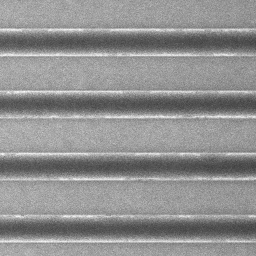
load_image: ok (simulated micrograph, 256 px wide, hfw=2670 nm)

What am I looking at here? lines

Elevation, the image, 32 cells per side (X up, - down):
--------------------------------
--------------------------------
--------------------------------
--------------------------------
XXXXXXXXXXXXXXXXXXXXXXXXXXXXXXXX
XXXXXXXXXXXXXXXXXXXXXXXXXXXXXXXX
XXXXXXXXXXXXXXXXXXXXXXXXXXXXXXXX
--------------------------------
--------------------------------
--------------------------------
--------------------------------
XXXXXXXXXXXXXXXXXXXXXXXXXXXXXXXX
XXXXXXXXXXXXXXXXXXXXXXXXXXXXXXXX
XXXXXXXXXXXXXXXXXXXXXXXXXXXXXXXX
XXXXXXXXXXXXXXXXXXXXXXXXXXXXXXXX
--------------------------------
--------------------------------
--------------------------------
--------------------------------
XXXXXXXXXXXXXXXXXXXXXXXXXXXXXXXX
XXXXXXXXXXXXXXXXXXXXXXXXXXXXXXXX
XXXXXXXXXXXXXXXXXXXXXXXXXXXXXXXX
--------------------------------
--------------------------------
--------------------------------
--------------------------------
--------------------------------
XXXXXXXXXXXXXXXXXXXXXXXXXXXXXXXX
XXXXXXXXXXXXXXXXXXXXXXXXXXXXXXXX
XXXXXXXXXXXXXXXXXXXXXXXXXXXXXXXX
--------------------------------
--------------------------------